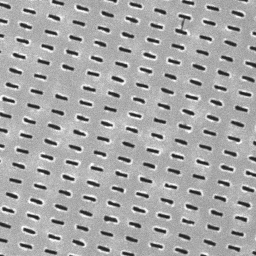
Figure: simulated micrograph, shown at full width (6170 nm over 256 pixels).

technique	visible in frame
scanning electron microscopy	a regular array of holes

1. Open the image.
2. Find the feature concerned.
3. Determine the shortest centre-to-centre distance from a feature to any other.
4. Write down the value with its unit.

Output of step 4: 364 nm